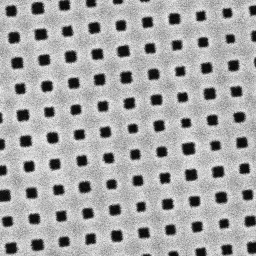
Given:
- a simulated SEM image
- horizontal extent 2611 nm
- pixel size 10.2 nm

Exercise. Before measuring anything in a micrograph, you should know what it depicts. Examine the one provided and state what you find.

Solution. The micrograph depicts a regular array of holes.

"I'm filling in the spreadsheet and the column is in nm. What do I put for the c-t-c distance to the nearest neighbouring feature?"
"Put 264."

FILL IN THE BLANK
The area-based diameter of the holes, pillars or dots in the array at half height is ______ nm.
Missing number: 133